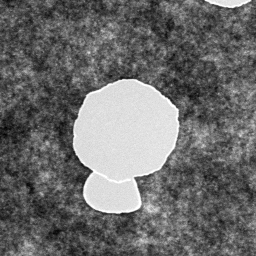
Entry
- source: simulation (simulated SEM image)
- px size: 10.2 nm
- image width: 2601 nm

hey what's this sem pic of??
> raised bodies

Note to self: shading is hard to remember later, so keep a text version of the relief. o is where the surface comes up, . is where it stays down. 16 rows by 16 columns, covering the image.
................
................
................
................
................
......oooo......
.....oooooo.....
.....oooooo.....
.....oooooo.....
.....oooooo.....
.....ooooo......
.....oooo.......
.....oooo.......
................
................
................